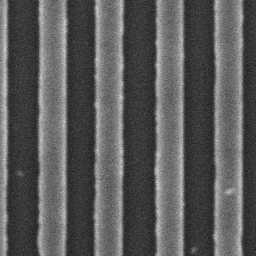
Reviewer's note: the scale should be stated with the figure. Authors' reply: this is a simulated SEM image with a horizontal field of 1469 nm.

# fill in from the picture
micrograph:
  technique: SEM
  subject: lines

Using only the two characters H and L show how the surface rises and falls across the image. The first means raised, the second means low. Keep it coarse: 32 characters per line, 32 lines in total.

HLLLLHHHLLLLHHHLLLLLHHHLLLLHHHLL
HLLLLHHHLLLLHHHLLLLLHHHLLLLHHHLL
HLLLLHHHLLLLHHHLLLLLHHHLLLLHHHLL
HLLLLHHHLLLLHHHLLLLLHHHLLLLHHHLL
HLLLLHHHLLLLHHHLLLLLHHHLLLLHHHLL
HLLLLHHHLLLLHHHLLLLLHHHLLLLHHHLL
HLLLLHHHLLLLHHHLLLLLHHHLLLLHHHLL
HLLLLHHHLLLLHHHLLLLLHHHLLLLHHHLL
HLLLLHHHLLLLHHHLLLLLHHHLLLLHHHLL
HLLLLHHHLLLLHHHLLLLLHHHLLLLHHHLL
HLLLLHHHLLLLHHHLLLLLHHHLLLLHHHLL
HLLLLHHHLLLLHHHLLLLLHHHLLLLHHHLL
HLLLLHHHLLLLHHHLLLLLHHHLLLLHHHLL
HLLLLHHHLLLLHHHLLLLLHHHLLLLHHHLL
HLLLLHHHLLLLHHHLLLLLHHHLLLLHHHLL
HLLLLHHHLLLLHHHLLLLLHHHLLLLHHHLL
HLLLLHHHLLLLHHHLLLLLHHHLLLLHHHLL
HLLLLHHHLLLLHHHLLLLLHHHLLLLHHHLL
HLLLLHHHLLLLHHHLLLLLHHHLLLLHHHLL
HLLLLHHHLLLLHHHLLLLLHHHLLLLHHHLL
HLLLLHHHLLLLHHHLLLLLHHHLLLLHHHLL
HLLLLHHHLLLLHHHLLLLHHHHLLLLHHHLL
HLLLLHHHLLLLHHHLLLLLHHHLLLLHHHLL
HLLLLHHHLLLLHHHLLLLLHHHLLLLHHHLL
HLLLLHHHLLLLHHHLLLLLHHHLLLLHHHLL
HLLLLHHHLLLLHHHLLLLLHHHLLLLHHHLL
HLLLLHHHLLLLHHHLLLLLHHHLLLLHHHLL
HLLLLHHHLLLLHHHLLLLLHHHLLLLHHHLL
HLLLLHHHLLLLHHHLLLLLHHHLLLLHHHLL
HLLLLHHHLLLLHHHLLLLLHHHLLLLHHHLL
HLLLLHHHLLLLHHHLLLLLHHHLLLLHHHLL
HLLLLHHHLLLLHHHLLLLLHHHLLLLHHHLL